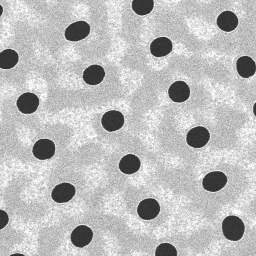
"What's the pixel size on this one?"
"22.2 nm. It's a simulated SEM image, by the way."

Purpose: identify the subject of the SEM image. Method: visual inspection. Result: a regular array of holes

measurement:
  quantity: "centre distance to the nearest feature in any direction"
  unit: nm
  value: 1050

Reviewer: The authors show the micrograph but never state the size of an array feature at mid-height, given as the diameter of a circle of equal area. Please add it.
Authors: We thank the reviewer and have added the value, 497 nanometers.